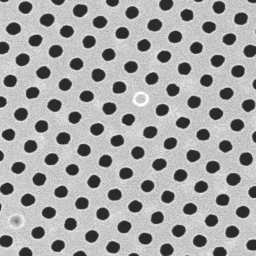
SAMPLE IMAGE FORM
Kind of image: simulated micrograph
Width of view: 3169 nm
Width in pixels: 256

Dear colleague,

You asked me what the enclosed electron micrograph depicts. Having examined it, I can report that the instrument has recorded a regular array of holes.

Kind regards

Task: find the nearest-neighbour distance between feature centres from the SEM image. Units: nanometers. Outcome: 288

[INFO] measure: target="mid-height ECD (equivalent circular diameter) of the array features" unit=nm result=164